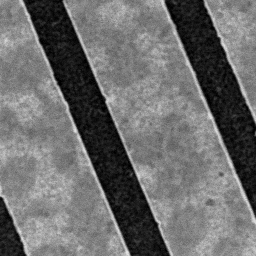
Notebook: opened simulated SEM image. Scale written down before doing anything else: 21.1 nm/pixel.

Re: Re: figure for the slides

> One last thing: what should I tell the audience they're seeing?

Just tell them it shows one or a few lines or trenches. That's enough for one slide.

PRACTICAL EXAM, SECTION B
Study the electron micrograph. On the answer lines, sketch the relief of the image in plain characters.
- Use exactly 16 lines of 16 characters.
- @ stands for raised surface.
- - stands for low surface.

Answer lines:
@@--@@@@@@---@@@
@@---@@@@@@--@@@
@@---@@@@@@---@@
@@@--@@@@@@@--@@
@@@---@@@@@@---@
@@@@--@@@@@@---@
@@@@---@@@@@@---
@@@@---@@@@@@---
@@@@@---@@@@@@--
@@@@@---@@@@@@--
@@@@@@--@@@@@@--
@@@@@@---@@@@@@-
@@@@@@@--@@@@@@-
-@@@@@@---@@@@@@
-@@@@@@---@@@@@@
--@@@@@@---@@@@@